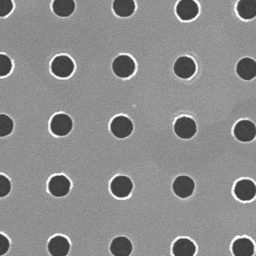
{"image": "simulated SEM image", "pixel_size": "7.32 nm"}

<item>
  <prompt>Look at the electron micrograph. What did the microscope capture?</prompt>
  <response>a regular array of holes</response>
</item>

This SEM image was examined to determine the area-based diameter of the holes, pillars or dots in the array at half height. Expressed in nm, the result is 169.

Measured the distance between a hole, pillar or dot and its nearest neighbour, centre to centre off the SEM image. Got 59.6 px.